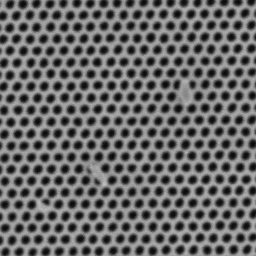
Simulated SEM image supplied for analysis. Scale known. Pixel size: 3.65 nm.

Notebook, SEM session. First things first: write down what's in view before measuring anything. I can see a regular array of holes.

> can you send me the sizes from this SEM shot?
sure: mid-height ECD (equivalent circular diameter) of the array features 0.0339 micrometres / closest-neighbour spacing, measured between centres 0.0473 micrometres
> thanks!